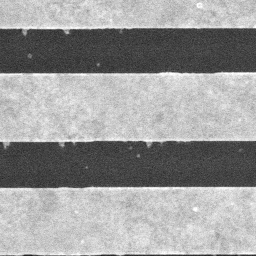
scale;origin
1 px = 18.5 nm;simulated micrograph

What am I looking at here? lines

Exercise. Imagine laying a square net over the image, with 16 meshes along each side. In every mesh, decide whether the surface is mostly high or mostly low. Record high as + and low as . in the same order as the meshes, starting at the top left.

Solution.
++++++++++++++++
++++++++++++++++
................
................
................
++++++++++++++++
++++++++++++++++
++++++++++++++++
++++++++++++++++
................
................
................
++++++++++++++++
++++++++++++++++
++++++++++++++++
++++++++++++++++